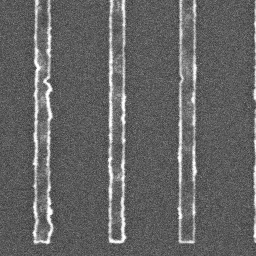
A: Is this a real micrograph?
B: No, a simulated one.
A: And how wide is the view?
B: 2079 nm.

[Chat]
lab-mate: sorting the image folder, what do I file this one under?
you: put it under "one or a few lines or trenches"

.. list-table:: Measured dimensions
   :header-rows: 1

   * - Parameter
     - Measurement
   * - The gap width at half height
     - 482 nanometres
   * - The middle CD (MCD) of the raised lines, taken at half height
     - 120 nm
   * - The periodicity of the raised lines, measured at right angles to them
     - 589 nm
